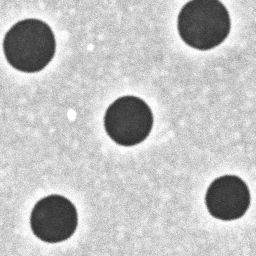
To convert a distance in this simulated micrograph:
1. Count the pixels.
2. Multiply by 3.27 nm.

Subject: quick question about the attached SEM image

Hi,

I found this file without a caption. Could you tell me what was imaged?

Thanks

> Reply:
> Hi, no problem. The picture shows holes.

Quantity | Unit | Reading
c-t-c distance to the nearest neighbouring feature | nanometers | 405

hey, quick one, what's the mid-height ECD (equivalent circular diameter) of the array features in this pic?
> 163 nm